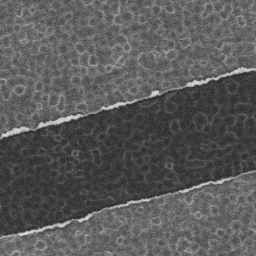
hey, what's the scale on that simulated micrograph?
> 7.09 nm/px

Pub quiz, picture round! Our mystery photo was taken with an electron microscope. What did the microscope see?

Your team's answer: one or a few lines or trenches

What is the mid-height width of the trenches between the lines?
690 nm